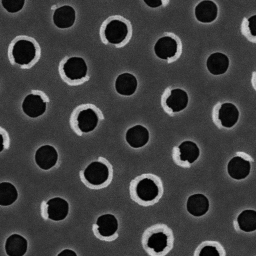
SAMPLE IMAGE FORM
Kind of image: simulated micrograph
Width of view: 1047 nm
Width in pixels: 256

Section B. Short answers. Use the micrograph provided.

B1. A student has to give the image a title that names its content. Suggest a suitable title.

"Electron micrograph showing a regular array of holes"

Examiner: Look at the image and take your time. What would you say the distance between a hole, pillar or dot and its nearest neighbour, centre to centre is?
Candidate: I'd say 52.6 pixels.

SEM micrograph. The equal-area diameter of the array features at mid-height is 23.2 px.